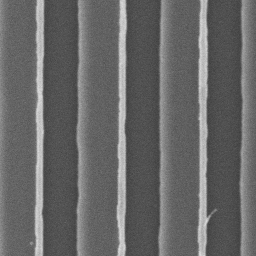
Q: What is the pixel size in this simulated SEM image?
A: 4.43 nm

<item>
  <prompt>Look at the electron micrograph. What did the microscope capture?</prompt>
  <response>lines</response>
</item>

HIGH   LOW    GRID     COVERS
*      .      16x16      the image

***..***..***..*
***..***..***..*
***..***..***..*
***..***..***..*
***..***..***..*
***..***..***..*
***..***..***..*
***..***..***..*
***..***..***..*
***..***..***..*
***..***..***..*
***..***..***..*
***..***..***..*
***..***..***..*
***..***..***..*
***..***..***..*